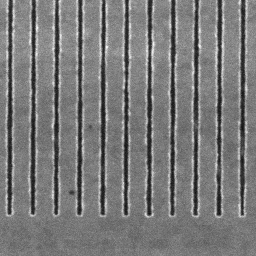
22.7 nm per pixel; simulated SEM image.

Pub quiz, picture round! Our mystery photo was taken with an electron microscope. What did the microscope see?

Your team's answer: parallel lines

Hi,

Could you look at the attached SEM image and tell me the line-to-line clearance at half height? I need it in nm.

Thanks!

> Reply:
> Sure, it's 122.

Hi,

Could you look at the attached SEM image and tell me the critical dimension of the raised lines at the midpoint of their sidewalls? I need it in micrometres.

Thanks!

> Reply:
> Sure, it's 0.415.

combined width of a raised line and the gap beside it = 529 nm